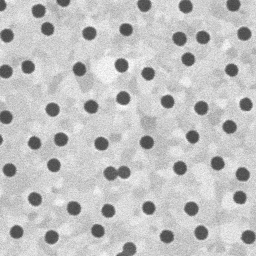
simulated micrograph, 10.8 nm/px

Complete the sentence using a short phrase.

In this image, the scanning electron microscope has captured a regular array of holes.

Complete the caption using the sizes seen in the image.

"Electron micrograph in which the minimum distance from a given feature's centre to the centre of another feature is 0.324 µm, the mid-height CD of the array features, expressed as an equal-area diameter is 159 nm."